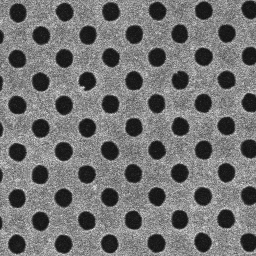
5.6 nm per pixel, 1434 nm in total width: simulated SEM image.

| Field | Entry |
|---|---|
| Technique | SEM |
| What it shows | a regular array of holes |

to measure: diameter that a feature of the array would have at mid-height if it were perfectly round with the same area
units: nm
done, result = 101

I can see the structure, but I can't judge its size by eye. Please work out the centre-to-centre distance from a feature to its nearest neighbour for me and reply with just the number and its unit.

181 nm